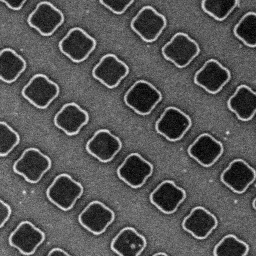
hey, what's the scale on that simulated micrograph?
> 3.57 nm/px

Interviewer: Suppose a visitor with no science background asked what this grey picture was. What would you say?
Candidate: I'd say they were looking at a regular array of raised bodies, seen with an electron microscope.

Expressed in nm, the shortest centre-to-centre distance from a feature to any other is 147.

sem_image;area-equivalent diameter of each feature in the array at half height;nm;110